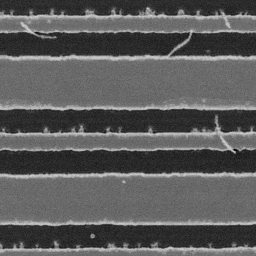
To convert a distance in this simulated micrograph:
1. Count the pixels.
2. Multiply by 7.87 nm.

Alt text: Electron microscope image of lines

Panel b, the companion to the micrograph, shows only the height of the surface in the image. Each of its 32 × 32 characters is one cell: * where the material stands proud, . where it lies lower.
................................
................................
********************************
********************************
................................
................................
................................
********************************
********************************
********************************
********************************
********************************
********************************
********************************
................................
................................
...........................*....
********************************
********************************
................................
................................
................................
********************************
********************************
********************************
********************************
********************************
********************************
................................
................................
................................
********************************